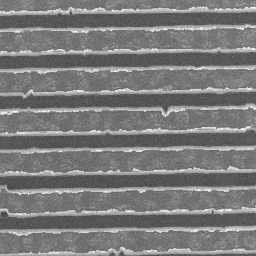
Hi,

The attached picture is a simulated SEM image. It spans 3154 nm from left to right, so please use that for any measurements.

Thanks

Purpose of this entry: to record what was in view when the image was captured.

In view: parallel lines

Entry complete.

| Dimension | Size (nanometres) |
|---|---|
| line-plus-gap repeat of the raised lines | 496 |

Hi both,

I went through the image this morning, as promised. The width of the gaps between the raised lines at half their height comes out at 188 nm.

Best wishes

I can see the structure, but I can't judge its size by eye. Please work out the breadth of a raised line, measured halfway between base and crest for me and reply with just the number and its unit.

306 nm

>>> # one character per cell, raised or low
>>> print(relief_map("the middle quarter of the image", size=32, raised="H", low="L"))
LLLLLLLLLLLLLLLLLLLLLLLLLLLLLLLL
HHHHHHHHHHHHHHHHHHHHHHHHHHHHHHHH
HHHHHHHHHHHHHHHHHHHHHHHHHHHHHHHH
HHHHHHHHHHHHHHHHHHHHHHHHHHHHHHHH
HHHHHHHHHHHHHHHHHHHHHHHHHHHHHHHH
HHHHHHHHHHHHHHHHHHHHHHHHHHHHHHHH
HHHHHHHHHHHHHHHHHHHHHHHHHHHHHHHH
HHLLLLLLLLLLLLLLLLLLLLLLLLLLLLLL
LLLLLLLLLLLLLLLLLLLLLLLLLLLLLLLL
LLLLLLLLLLLLLLLLLLLLLLLLLLLLLLLL
LLLLLLLLLLLLLLLLLLLLLLLLLLLLLLLL
HHHHHHHHHHHHHHHHHHHHHHHHHLHHHHHH
HHHHHHHHHHHHHHHHHHHHHHHHHHHHHHHH
HHHHHHHHHHHHHHHHHHHHHHHHHHHHHHHH
HHHHHHHHHHHHHHHHHHHHHHHHHHHHHHHH
HHHHHHHHHHHHHHHHHHHHHHHHHHHHHHHH
HHHHHHHHHHHHHHHHHHHHHHHHHHHHHHHH
LLLLLLLLLLLLLLLLLLLLLLLLLLLLLLLL
LLLLLLLLLLLLLLLLLLLLLLLLLLLLLLLL
LLLLLLLLLLLLLLLLLLLLLLLLLLLLLLLL
LLLLLLLLLLLLLLLLLLLLLLLLLLLLLLLL
HHHHHHHHHHHHHHHHHHHHHHHHHHHHHHHH
HHHHHHHHHHHHHHHHHHHHHHHHHHHHHHHH
HHHHHHHHHHHHHHHHHHHHHHHHHHHHHHHH
HHHHHHHHHHHHHHHHHHHHHHHHHHHHHHHH
HHHHHHHHHHHHHHHHHHHHHHHHHHHHHHHH
HHHHHHHHHHHHHHHHHHHHHHHHHHHHHHHH
LLLLLLLLHHLLLLLLLLLLLLLLLLLLLLLL
LLLLLLLLLLLLLLLLLLLLLLLLLLLLLLLL
LLLLLLLLLLLLLLLLLLLLLLLLLLLLLLLL
LLLLLLLLLLLLLLLLLLLLLLLLLLLLLLLL
HHHHHHHHLLLLLLHHHHHHHHHHHHHHHHHH